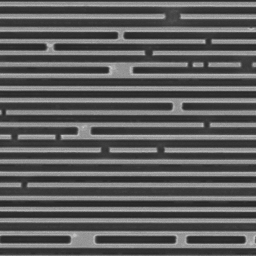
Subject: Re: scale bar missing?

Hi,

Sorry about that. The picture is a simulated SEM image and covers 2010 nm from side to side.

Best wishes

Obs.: parallel lines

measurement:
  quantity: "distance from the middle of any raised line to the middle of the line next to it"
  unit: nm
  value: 94.8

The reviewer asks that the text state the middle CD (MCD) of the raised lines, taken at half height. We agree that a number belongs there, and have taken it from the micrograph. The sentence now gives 37.3 nm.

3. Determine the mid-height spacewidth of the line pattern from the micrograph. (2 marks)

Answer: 0.0589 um